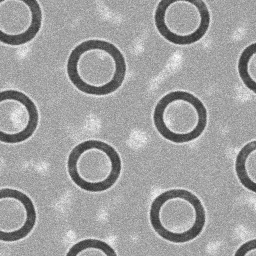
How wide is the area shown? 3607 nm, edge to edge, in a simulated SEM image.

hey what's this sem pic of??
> ring-shaped grooves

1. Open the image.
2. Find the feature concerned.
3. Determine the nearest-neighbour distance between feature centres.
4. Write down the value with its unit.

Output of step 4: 1370 nm